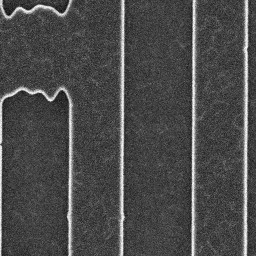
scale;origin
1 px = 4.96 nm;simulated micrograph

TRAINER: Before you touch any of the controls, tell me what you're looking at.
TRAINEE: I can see one or a few lines or trenches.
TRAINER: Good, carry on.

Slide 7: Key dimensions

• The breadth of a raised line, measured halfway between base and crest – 0.266 micrometres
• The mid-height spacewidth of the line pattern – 348 nm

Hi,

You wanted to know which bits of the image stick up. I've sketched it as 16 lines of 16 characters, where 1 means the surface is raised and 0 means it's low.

0010111100001110
1111111100001110
1111111100001110
1111111100001110
1111111100001110
1111111100001110
0000111100001110
0000111100001110
0000111100001110
0000111100001110
0000111100001110
0000111100001110
0000111100001110
0000111100001110
0000111100001110
0000111100001110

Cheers